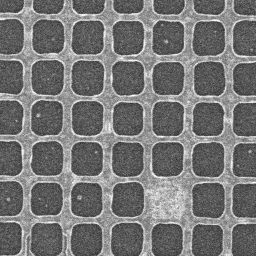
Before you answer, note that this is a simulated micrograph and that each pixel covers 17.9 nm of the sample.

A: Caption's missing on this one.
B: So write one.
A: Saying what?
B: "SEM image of a regular array of holes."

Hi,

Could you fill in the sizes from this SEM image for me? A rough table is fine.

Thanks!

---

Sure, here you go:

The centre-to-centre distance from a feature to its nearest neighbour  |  718 nm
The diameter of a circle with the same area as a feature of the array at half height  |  650 nm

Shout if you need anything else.